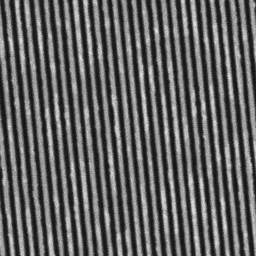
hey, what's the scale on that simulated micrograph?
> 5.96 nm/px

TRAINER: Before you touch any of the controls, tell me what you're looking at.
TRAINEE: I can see parallel lines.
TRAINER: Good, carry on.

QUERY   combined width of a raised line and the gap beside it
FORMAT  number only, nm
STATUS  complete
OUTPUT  58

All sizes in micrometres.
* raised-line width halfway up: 0.0281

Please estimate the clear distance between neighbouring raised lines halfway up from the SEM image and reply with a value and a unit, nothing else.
33.3 nm